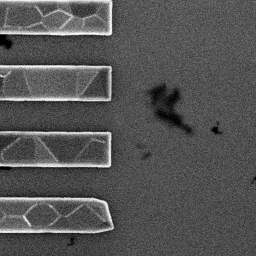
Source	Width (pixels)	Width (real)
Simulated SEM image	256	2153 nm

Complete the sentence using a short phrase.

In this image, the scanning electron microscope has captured wiring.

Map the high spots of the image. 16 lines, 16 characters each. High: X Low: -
XXXXXXX---------
XXXXXXX---------
----------------
----------------
XXXXXXX---------
XXXXXXX---------
----------------
----------------
XXXXXXX---------
XXXXXXX---------
----------------
----------------
XXXXXX----------
XXXXXXX---------
-----X----------
----------------